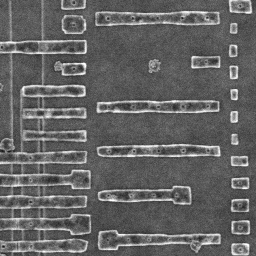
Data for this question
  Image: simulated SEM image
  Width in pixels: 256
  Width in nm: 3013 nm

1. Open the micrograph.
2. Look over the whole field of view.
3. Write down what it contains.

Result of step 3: wiring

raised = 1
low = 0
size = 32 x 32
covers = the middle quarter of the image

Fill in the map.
11111000000000000000011100000000
11111000000000000000011000000000
11111000000000000000000000000000
00000000000000000000000000000000
00000000000000000000000000000000
01110000000000000000000000000000
11111000000000000000000000000000
11111000000000000000000000000000
00000000000000000000000000000000
00000000000000111111111001111111
00000000111111111111111111111111
11111000111111111111111111111111
11111000000000000000000000000000
00000000000000000000000000000000
00000000000000000000000000000000
00000000000000000000000000000000
00000000000000000000000000000000
11111000000000000000000000000000
11111000000000000000000000000000
00000000000000000000000000000000
00000000000000000000000111111111
00000000111111111111111111111111
11111000011111111111111111111111
11111000000000000000000000000000
11111000000000000000000000000000
00000000000000000000000000000000
00000000000000000000000000000000
00111100000000000000000000000000
11111100000000000000000000000000
11111100000000000000000000000000
00111100000000000000000000000000
00000000000000000000000011111111